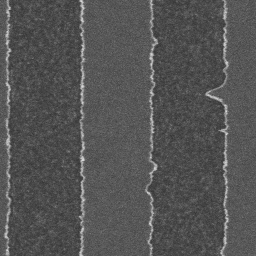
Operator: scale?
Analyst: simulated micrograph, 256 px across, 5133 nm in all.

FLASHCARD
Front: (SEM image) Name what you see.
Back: one or a few lines or trenches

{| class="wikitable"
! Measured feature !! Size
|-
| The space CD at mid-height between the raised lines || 1450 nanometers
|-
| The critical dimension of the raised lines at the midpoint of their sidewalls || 70.4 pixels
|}